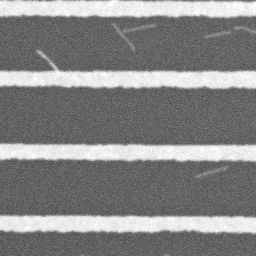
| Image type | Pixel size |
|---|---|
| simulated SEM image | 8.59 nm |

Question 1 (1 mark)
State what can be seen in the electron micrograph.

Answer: lines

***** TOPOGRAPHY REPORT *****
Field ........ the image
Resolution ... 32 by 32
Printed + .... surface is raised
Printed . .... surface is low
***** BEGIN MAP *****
++++++++++++++++++++++++++++++++
++++++++++++++++++++++++++++++++
................................
................................
................................
................................
................................
................................
................................
++++++++++++++++++++++++++++++++
++++++++++++++++++++++++++++++++
................................
................................
................................
................................
................................
................................
................................
++++++++++++++++++++++++++++++++
++++++++++++++++++++++++++++++++
................................
................................
................................
................................
................................
................................
................................
++++++++++++++++++++++++++++++++
++++++++++++++++++++++++++++++++
................................
................................
................................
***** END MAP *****